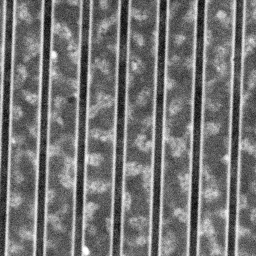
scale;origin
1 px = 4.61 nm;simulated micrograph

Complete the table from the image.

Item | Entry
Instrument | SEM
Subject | parallel lines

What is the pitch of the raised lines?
0.177 um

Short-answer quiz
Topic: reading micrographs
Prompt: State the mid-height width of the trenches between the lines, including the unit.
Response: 0.0392 microns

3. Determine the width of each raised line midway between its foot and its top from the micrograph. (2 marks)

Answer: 138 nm